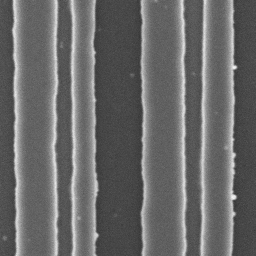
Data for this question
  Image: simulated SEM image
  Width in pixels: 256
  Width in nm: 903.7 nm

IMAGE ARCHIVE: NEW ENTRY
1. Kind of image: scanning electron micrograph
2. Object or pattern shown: lines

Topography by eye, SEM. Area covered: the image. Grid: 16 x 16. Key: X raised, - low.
-XXXXX---XXXXXX-
-XXXXX---XXXXXX-
-XXXXX---XXXXXX-
-XXXXX---XXXXXX-
-XXXXX---XXXXXX-
-XXXXX---XXXXXX-
-XXXXX---XXXXXX-
-XXXXX---XXXXXX-
-XXXXX---XXXXXX-
-XXXXX---XXXXXX-
-XXXXX---XXXXXX-
-XXXXX---XXXXXX-
-XXXXX---XXXXXX-
-XXXXX---XXXXXX-
-XXXXX---XXXXXX-
-XXXXX---XXXXX--